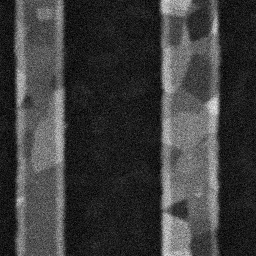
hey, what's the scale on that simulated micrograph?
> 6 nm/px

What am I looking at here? one or a few lines or trenches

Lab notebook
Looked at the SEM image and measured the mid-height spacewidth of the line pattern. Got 645 nm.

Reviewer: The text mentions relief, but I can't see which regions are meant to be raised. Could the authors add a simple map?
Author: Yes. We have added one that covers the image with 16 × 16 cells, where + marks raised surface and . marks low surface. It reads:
.+++......+++...
.+++......+++...
.+++......+++...
.+++......+++...
.+++......+++...
.+++......+++...
.+++......+++...
.+++......+++...
.+++......+++...
.+++......+++...
.+++......+++...
.+++......+++...
.+++......+++...
.+++......+++...
.+++......+++...
.+++......+++...